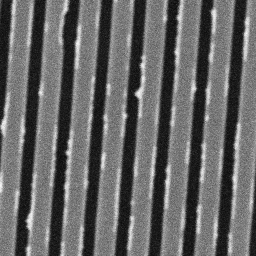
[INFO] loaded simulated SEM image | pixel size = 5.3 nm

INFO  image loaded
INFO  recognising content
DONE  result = parallel lines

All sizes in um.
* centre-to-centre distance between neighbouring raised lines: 0.177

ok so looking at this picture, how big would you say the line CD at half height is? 111 nanometers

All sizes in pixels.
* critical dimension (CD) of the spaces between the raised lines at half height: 12.6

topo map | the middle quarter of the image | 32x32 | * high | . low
...*****...*****...******...****
...*****...*****...*****....****
...*****...*****...*****....****
...*****...*****...*****....****
...*****...*****...*****....****
...*****...*****...*****....****
..*****....*****..******...*****
..*****....*****..******...*****
..*****....*****..******...*****
..*****....****....*****...*****
..*****....****....*****...*****
..*****...*****....*****...*****
..*****...******...*****...*****
..*****...******...****....*****
..*****...*****....****....*****
..*****...*****....****....*****
..*****...*****...*****....*****
..*****...*****...*****....*****
.******...*****...*****....*****
.*****....*****...*****...******
.*****....*****...*****...*****.
.*****....*****...*****...******
.*****....****....*****...*****.
.*****...*****....*****...*****.
.*****...*****....*****...*****.
.*****...*****....*****...*****.
******...*****...******...*****.
******...*****....****....*****.
******...*****....****....*****.
******...*****...*****...******.
******...*****...*****...******.
******...*****...*****...******.